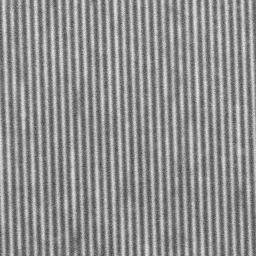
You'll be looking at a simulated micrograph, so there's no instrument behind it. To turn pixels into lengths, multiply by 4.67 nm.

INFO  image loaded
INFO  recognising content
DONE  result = parallel lines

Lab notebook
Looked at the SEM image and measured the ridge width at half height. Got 1.5 px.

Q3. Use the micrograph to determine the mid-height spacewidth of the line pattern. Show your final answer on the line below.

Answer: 29.8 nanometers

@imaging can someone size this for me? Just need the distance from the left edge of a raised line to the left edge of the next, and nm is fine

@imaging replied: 37.1